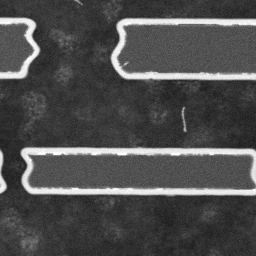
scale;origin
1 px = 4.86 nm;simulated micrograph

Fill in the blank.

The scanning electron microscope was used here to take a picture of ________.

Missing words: one or a few lines or trenches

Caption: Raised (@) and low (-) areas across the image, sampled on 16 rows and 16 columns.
----------------
@@------@@@@@@@@
@@------@@@@@@@@
@@-----@@@@@@@@@
@-------@@@@@@@@
----------------
----------------
----------------
----------------
--@@@@@@@@@@@@--
--@@@@@@@@@@@@@@
--@@@@@@@@@@@@@@
----------------
----------------
----------------
----------------